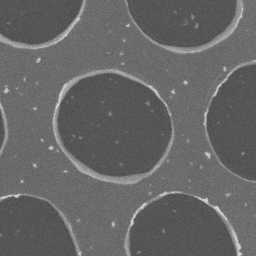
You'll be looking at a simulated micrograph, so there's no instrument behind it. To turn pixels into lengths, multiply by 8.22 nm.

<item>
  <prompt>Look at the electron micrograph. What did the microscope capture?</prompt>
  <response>holes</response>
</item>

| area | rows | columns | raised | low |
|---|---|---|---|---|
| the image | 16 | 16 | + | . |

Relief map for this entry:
.....+++.......+
....+++++......+
+..+++++++...+++
++++++++++++++++
+++++++++++++++.
++++.....+++++..
++++......+++...
++++.......++...
++++.......++...
++++......+++...
+++++.....++++..
++++++++++++++++
...+++++++..++++
....+++++.....++
....++++......++
.....+++.......+